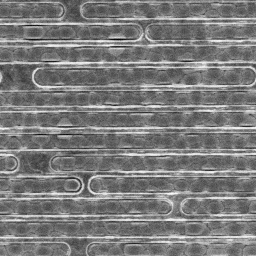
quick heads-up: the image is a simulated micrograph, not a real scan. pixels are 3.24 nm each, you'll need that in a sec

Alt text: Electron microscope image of parallel lines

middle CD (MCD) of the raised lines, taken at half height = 19.5 nm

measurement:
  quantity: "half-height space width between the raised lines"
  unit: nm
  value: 52.3